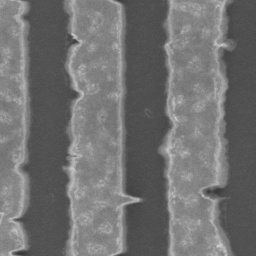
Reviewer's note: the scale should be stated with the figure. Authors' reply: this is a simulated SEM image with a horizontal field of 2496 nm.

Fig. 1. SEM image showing one or a few lines or trenches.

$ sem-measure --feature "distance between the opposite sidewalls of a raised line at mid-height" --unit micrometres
0.515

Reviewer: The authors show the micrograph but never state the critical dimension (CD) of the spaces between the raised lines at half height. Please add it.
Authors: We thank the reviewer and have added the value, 436 nm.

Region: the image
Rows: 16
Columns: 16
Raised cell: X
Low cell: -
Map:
XX--XXXX---XXX--
XX--XXXX--XXXX--
XX---XXX--XXXX--
XX--XXXX--XXXX--
XX--XXXX---XXX--
XX---XXX---XXX--
XX---XXX--XXXX--
XX--XXXX---XXX--
XX--XXXX--XXXX--
XX--XXXX--XXXX--
X---XXXX--XXXX--
XX--XXXX---XXX--
XX--XXXX---XX---
X----XXX---XX---
X---XXXX---XXX--
X---XXXX---XXX--